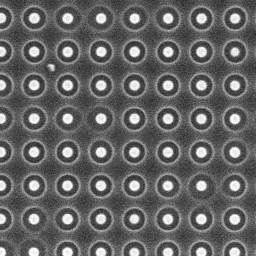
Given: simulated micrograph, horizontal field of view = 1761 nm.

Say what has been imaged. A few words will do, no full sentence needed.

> an array of small figures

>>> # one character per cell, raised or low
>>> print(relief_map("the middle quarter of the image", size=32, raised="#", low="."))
################################
################################
#################.##############
...####....####.....####....####
...####.....###.....###......###
....##......###......##......##.
...####.....###.....###......###
...####....#####...#####....####
################################
################################
################################
...####....#####...#####....####
....##......###.....###.....####
....##......###.....###......###
....##......###.....###......###
....##......###.....####....####
...####....######.##############
################################
################################
..#####....######..######..#####
...####.....###.....####....####
....##......###.....###......###
....##......###.....###......##.
...####.....###.....####....####
..######...#####...######..#####
################################
################################
################################
...####....#####....####....####
....###.....###.....###......##.
....##......###.....###......##.
....###.....###.....###......##.